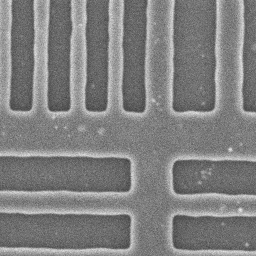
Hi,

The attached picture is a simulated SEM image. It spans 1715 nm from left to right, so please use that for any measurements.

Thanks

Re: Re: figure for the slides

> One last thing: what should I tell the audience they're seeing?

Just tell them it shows groups of lines, slits or small figures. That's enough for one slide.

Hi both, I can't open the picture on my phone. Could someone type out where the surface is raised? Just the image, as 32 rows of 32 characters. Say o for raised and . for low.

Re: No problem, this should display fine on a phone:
o...oo...oo...o...oooo.....ooo..
o...oo...oo...o...oooo.....ooo..
o...oo...oo...o...oooo.....ooo..
o...oo...oo...o...oooo.....ooo..
o...oo...oo...o...oooo.....ooo..
o...oo...oo...o...oooo.....ooo..
o...oo...oo...o...oooo.....ooo..
o...oo...oo...o...oooo.....ooo..
o...oo...oo...o...oooo.....ooo..
o...oo...oo...o...oooo.....ooo..
o...oo...oo...o...oooo.....ooo..
o...oo...oo...o...oooo.....ooo..
o...oo...oo...o...oooo.....ooo..
o...oo...oo..oo...oooo.....ooo..
oooooooooooooooooooooooooooooooo
oooooooooooooooooooooooooooooooo
oooooooooooooooooooooooooooooooo
oooooooooooooooooooooooooooooooo
oooooooooooooooooooooooooooooooo
..oo.oo.oooooooooooooooooooooooo
................oooooo..........
................ooooo...........
................oooooo..........
................oooooo..........
oooooooooooooooooooooooooooooooo
oooooooooooooooooooooooooooooooo
oooooooooooooooooooooooooooooooo
................oooooo..........
................ooooo...........
................ooooo...........
................oooooo..........
oooooooooooooooooooooooooooooooo